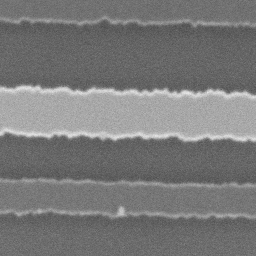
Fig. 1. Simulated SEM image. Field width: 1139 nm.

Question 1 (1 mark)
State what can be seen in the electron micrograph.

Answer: lines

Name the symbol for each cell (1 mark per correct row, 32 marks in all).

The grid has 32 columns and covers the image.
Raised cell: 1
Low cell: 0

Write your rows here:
11111111111111111111111111111111
11111111111111111111111111111111
01111111111111111111111111111111
00000000000000000000000000000000
00000000000000000000000000000000
00000000000000000000000000000000
00000000000000000000000000000000
00000000000000000000000000000000
00000000000000000000000000000000
00000000000000000000000000000000
00000000000000000000000000000000
11111111110111101001100000110000
11111111111111111111111111111111
11111111111111111111111111111111
11111111111111111111111111111111
11111111111111111111111111111111
11111111111111111111111111111111
00000000000000000000000000000000
00000000000000000000000000000000
00000000000000000000000000000000
00000000000000000000000000000000
00000000000000000000000000000000
00001100000000000000000000000000
11111111111111111111111111111111
11111111111111111111111111111111
11111111111111111111111111111111
11111101111111111111111111111111
00000000000000000000000000000000
00000000000000000000000000000000
00000000000000000000000000000000
00000000000000000000000000000000
00000000000000000000000000000000